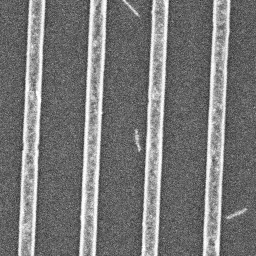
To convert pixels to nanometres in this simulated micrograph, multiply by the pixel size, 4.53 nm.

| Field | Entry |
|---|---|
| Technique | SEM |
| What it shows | parallel lines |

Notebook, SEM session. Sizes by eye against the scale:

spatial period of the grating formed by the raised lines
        0.279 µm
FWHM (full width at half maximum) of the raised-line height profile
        14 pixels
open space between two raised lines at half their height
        219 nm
